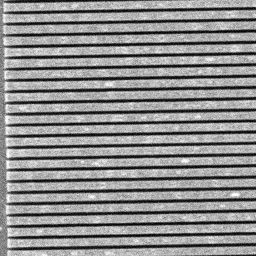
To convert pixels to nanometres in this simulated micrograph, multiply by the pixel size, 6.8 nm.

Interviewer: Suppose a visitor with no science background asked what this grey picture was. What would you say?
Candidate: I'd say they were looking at parallel lines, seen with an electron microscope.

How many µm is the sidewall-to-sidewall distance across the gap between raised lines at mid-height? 0.023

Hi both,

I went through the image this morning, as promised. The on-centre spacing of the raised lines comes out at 76.5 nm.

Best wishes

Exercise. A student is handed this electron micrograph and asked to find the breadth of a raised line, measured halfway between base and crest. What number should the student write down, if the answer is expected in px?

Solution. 8.57